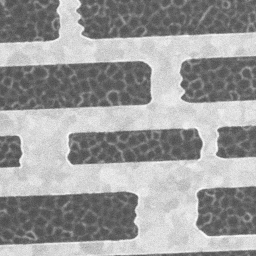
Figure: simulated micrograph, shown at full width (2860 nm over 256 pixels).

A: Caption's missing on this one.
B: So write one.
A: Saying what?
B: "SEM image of one or a few lines or trenches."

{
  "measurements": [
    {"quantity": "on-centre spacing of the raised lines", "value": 714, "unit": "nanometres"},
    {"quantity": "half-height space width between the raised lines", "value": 509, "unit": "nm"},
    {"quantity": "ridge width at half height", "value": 269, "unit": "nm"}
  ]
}